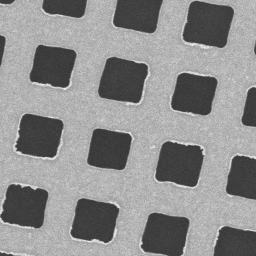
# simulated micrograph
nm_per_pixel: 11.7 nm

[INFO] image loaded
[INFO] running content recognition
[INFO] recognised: holes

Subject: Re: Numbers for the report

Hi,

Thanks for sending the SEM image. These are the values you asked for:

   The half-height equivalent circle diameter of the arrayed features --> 536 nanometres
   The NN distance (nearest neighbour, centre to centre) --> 831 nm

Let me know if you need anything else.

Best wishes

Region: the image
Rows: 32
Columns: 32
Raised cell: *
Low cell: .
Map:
*****......****.....****...*****
******.....***......****.....***
**************......***......***
***************.....***......***
***********************......***
.************************...****
****.....***********************
****.....****...****************
****.....****.....**************
****.....****.....****...*******
******...***......****.....*****
************......****.....****.
**************....***......****.
**********************....*****.
***..*************************..
**......***********************.
**......****..******************
**......***.....****************
**.....****.....****.....*******
*****..****.....****.....*****.*
***********.....****.....****...
*******************......****...
********************.....***....
*...************************....
*.....************************..
......****....******************
......***......*****************
......***......***.....*********
****.****.....****......****.***
*********.....****.....****.....
******************.....****.....
******************.....****.....